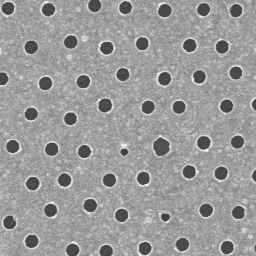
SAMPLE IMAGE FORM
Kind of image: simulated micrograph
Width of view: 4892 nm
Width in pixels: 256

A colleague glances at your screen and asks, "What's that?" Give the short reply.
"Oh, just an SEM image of a regular array of holes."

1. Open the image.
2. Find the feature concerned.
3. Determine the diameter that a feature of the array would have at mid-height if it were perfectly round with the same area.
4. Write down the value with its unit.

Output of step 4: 258 nm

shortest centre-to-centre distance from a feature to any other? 626 nm